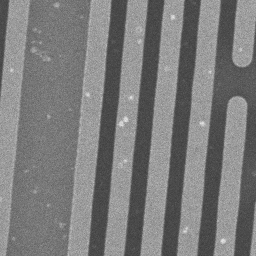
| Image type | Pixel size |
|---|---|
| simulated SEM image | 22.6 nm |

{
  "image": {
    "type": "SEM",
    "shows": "groups of lines, slits or small figures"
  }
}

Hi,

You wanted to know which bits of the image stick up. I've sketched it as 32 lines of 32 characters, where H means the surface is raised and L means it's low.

LHHHLLLLLLLHHHLLHHLLLHHLLHHHLLHH
LHHHLLLLLLLHHHLLHHLLHHHLLHHLLLHH
LHHLLLLLLLLHHHLLHHLLHHHLLHHLLHHH
LHHLLLLLLLLHHHLLHHLLHHHLLHHLLHHH
LHHLLLLLLLLHHLLLHHLLHHHLLHHLLHHH
LHHLLLLLLLLHHLLHHHLLHHLLLHHLLHHH
LHHLLLLLLLLHHLLHHHLLHHLLLHHLLHHH
HHHLLLLLLLLHHLLHHHLLHHLLHHHLLHHL
HHHLLLLLLLLHHLLHHHLLHHLLHHHLLLLL
HHHLLLLLLLLHHLLHHHLLHHLLHHHLLLLL
HHHLLLLLLLHHHLLHHLLLHHLLHHHLLLLL
HHHLLLLLLLHHHLLHHLLLHHLLHHHLLLLL
HHHLLLLLLLHHHLLHHLLHHHLLHHHLLHHL
HHLLLLLLLLHHHLLHHLLHHHLLHHLLHHHL
HHLLLLLLLLHHHLLHHLLHHHLLHHLLHHHL
HHLLLLLLLLHHLLLHHLLHHHLLHHLLHHHL
HHLLLLLLLLHHLLHHHLLHHLLLHHLLHHHL
HHLLLLLLLLHHLLHHHLLHHLLHHHLLHHHL
HHLLLLLLLLHHLLHHHLLHHLLHHHLLHHLL
HHLLLLLLLLHHLLHHHLLHHLLHHHLLHHLL
HHLLLLLLLLHHLLHHLLLHHLLHHHLLHHLL
HHLLLLLLLHHHLLHHLLLHHLLHHLLLHHLL
HLLLLLLLLHHHLLHHLLLHHLLHHLLLHHLL
HLLLLLLLLHHHLLHHLLHHHLLHHLLLHHLL
HLLLLLLLLHHHLLHHLLHHHLLHHLLHHHLL
HLLLLLLLLHHHLLHHLLHHHLLHHLLHHHLL
HLLLLLLLLHHLLLHHLLHHHLLHHLLHHHLL
HLLLLLLLLHHLLHHHLLHHLLLHHLLHHHLL
HLLLLLLLLHHLLHHHLLHHLLHHHLLHHLLL
HLLLLLLLLHHLLHHHLLHHLLHHHLLHHLLL
HLLLLLLLLHHLLHHHLLHHLLHHHLLHHLLH
HLLLLLLLHHHLLHHLLLHHLLHHHLLHHLLH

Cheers